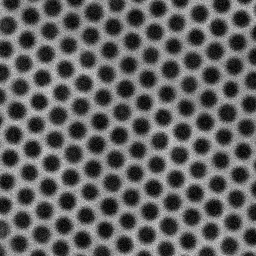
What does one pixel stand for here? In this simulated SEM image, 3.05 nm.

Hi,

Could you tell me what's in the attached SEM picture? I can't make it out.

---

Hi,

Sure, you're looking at a regular array of holes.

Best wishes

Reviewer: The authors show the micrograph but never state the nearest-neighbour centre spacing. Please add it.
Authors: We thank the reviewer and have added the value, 71.9 nanometres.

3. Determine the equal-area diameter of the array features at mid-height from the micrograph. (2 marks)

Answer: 18.5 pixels